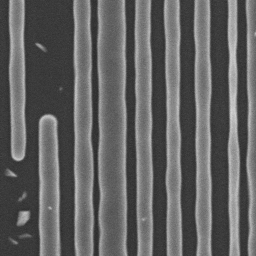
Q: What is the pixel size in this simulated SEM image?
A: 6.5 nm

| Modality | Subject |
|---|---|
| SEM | groups of lines, slits or small figures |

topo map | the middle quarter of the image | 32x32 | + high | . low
...++++..++++++...++++....+++...
...++++..++++++...++++....+++...
...+++...++++++...++++....+++...
...+++...++++++...++++....+++...
...++++..++++++...++++....+++...
...++++..++++++...++++....+++...
...++++..++++++...++++....+++...
...++++..++++++...++++....+++...
...++++..++++++...++++....+++...
...++++..++++++...++++....+++...
...++++..++++++...++++....+++...
...++++..++++++...++++....+++...
...++++..++++++...++++....+++...
...++++..++++++...++++....+++...
...++++..++++++...++++....+++...
...++++..++++++...++++....+++...
...++++..++++++...++++....+++...
...++++..++++++...++++....+++...
...+++...++++++...++++....+++...
...++++..++++++...++++....+++...
...++++..++++++...++++....+++...
...++++..++++++...++++....+++...
...++++..++++++...++++....+++...
...++++..++++++...++++....+++...
...++++..++++++...++++....+++...
...++++..++++++...++++....+++...
...++++..++++++...++++....+++...
...++++..++++++...++++....+++...
...++++..++++++...++++....+++...
...++++..++++++...++++....+++...
...++++..++++++...++++....+++...
...++++..++++++...++++....+++...